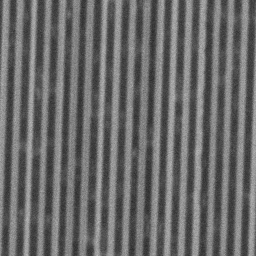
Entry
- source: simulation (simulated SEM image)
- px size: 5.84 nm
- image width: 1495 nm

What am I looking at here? parallel lines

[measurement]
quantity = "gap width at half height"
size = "0.054 um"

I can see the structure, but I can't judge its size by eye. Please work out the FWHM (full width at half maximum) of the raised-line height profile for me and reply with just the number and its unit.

27 nm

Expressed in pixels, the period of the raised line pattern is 14.1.